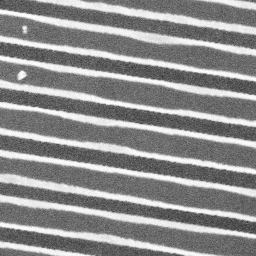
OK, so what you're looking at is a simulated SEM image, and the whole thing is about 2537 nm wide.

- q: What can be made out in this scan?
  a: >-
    lines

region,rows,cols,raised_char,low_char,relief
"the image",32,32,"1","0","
00000000011111111111111111111100
10000000000000001111111111111111
11111100000000000000001111111111
11111111111100000000000000000111
11111111111111111100000000000000
00011111111111111111111111000000
00000000001111111111111111111111
11000000000000001111111111111111
11111111000000000000000111111111
11111111111111100000000000000111
11111111111111111111100000000000
00000011111111111111111111100000
00000000000011111111111111111111
11110000000000000011111111111111
11111111100000000000000001111111
11111111111111100000000000000000
11111111111111111111110000000000
00000011111111111111111111110000
00000000000000111111111111111111
11000000000000000001111111111111
11111111110000000000000000111111
11111111111111110000000000000000
00111111111111111111110000000000
00000000111111111111111111111000
00000000000001111111111111111111
11111000000000000000111111111111
11111111111100000000000000111111
11111111111111111100000000000000
00011111111111111111111110000000
00000000001111111111111111111111
00000000000000000111111111111111
11111110000000000000001111111111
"